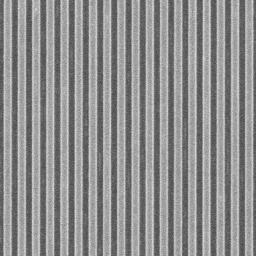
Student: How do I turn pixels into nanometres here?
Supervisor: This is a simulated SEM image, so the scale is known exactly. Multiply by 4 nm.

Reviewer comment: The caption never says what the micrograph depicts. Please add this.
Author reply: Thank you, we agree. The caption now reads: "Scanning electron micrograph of parallel lines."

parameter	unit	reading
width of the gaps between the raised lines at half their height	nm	26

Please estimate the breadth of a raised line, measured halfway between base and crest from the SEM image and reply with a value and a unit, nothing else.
29.5 nanometers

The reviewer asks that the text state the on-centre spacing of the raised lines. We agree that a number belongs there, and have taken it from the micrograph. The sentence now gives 56.8 nanometers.